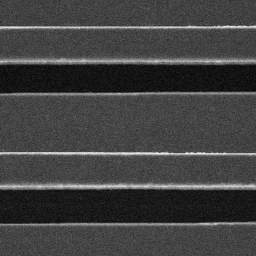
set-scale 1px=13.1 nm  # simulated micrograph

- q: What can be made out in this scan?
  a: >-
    lines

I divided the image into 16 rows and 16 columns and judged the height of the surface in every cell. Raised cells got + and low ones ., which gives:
++++++++++++++++
++++++++++++++++
++++++++++++++++
++++++++++++++++
................
................
++++++++++++++++
++++++++++++++++
++++++++++++++++
++++++++++++++++
++++++++++++++++
++++++++++++++++
................
................
++++++++++++++++
++++++++++++++++